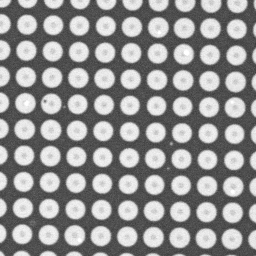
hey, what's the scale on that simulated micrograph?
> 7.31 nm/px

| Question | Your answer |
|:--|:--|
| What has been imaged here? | an array of small figures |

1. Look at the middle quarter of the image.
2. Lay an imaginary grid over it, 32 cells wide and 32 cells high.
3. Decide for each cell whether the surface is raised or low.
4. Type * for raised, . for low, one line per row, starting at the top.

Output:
................................
..***....**.....*...............
.*****..****...****..****...****
.*****..*****.*****..*****.*****
.*****..****..*****..*****.*****
..***...****...***...****...****
.............................*..
................................
..***...****...***....**....***.
.*****..****..*****..****...****
.*****..****..*****..****..*****
.****...****..*****..****..*****
.........**.....**....**....***.
................................
..**.....**.....................
.****...****...***...****...***.
.*****.*****..*****..****..*****
.*****..****..*****..****..*****
..***...****...***...****..*****
.............................*..
................................
.****...***....***....**.....*..
.****..*****..*****..****..****.
.****..*****..*****.*****..*****
.****...****..****..*****..*****
...*.....**....**....***....***.
................................
..**............................
.****...***...****...***....***.
.****..*****..****..*****..****.
.****..*****..****..*****..*****
.****...***...****...****..****.